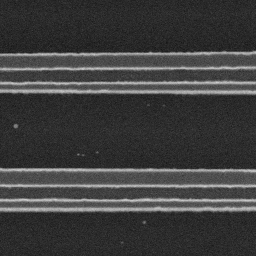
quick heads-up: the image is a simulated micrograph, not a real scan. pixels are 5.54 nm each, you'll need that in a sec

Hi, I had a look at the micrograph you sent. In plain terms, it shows lines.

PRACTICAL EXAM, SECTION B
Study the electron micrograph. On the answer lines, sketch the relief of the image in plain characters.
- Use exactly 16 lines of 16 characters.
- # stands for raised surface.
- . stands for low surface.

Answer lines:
................
................
................
################
################
################
................
................
................
................
................
################
################
................
................
................